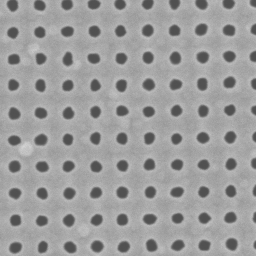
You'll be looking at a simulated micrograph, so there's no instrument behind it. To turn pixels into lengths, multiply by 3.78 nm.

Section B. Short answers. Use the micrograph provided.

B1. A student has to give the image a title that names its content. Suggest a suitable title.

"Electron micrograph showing a regular array of holes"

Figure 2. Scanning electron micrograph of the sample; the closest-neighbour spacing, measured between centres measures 99.2 nanometers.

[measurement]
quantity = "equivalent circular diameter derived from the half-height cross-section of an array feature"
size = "41.8 nm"